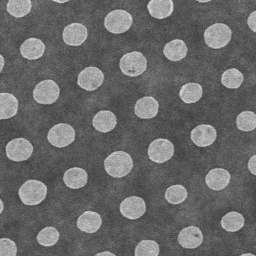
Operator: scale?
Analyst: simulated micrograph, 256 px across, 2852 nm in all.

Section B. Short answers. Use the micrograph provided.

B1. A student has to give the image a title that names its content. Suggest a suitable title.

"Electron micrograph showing a regular array of raised bodies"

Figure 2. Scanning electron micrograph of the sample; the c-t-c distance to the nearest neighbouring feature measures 493 nm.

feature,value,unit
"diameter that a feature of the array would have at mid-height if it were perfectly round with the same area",22.8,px